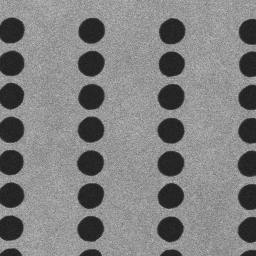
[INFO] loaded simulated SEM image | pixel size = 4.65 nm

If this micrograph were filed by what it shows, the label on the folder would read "a regular array of holes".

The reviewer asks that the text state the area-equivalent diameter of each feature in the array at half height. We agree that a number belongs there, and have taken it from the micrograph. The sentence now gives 0.116 micrometres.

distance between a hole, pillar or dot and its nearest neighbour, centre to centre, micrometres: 0.153